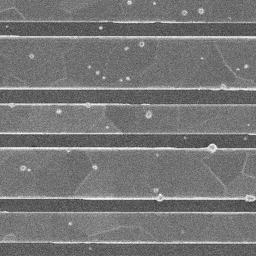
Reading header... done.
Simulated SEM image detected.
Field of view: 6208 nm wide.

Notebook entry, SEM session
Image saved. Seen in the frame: lines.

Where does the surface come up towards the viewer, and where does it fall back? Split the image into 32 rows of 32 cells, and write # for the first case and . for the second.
################################
################################
################################
................................
................................
################################
################################
################################
################################
################################
################################
................................
................................
################################
################################
################################
################################
................................
..........................##....
################################
################################
################################
################################
################################
################################
................................
#...............................
################################
################################
################################
................................
................................